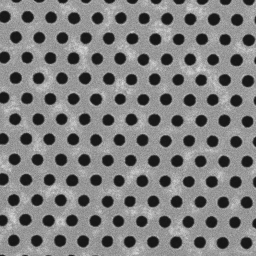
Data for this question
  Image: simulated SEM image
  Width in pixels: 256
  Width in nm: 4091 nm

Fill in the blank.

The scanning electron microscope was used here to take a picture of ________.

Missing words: a regular array of holes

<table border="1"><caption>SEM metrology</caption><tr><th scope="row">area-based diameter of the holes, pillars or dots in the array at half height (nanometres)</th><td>194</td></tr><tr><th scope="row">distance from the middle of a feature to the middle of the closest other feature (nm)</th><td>365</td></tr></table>